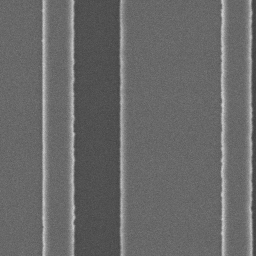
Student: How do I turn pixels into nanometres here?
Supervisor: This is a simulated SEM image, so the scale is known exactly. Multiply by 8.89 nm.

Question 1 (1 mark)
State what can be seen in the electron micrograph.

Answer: lines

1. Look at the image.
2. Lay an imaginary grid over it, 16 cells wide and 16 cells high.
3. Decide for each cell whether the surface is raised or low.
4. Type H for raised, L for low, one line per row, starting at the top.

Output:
HHHHHLLLHHHHHHHH
HHHHHLLLHHHHHHHH
HHHHHLLLHHHHHHHH
HHHHHLLLHHHHHHHH
HHHHHLLLHHHHHHHH
HHHHHLLLHHHHHHHH
HHHHHLLLHHHHHHHH
HHHHHLLLHHHHHHHH
HHHHHLLLHHHHHHHH
HHHHHLLLHHHHHHHH
HHHHHLLLHHHHHHHH
HHHHHLLLHHHHHHHH
HHHHHLLLHHHHHHHH
HHHHHLLLHHHHHHHH
HHHHHLLLHHHHHHHH
HHHHHLLLHHHHHHHH